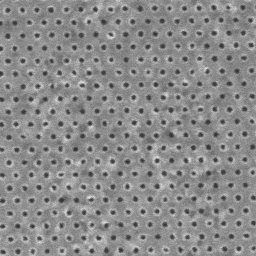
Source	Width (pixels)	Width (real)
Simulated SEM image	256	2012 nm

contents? a regular array of holes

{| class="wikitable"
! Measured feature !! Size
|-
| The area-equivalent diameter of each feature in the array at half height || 44.4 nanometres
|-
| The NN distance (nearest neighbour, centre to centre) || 111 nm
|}